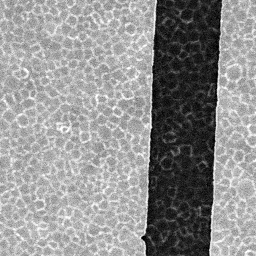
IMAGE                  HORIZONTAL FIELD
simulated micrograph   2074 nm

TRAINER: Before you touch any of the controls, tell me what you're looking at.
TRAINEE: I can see one or a few lines or trenches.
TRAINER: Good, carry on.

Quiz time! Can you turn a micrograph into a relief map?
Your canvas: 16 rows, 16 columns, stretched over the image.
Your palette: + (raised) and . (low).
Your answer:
++++++++++....++
++++++++++....++
++++++++++....++
++++++++++....++
++++++++++....++
+++++++++.....++
+++++++++.....++
+++++++++.....++
+++++++++....+++
+++++++++....+++
+++++++++....+++
+++++++++....+++
+++++++++....+++
+++++++++....+++
+++++++++....+++
+++++++++....+++